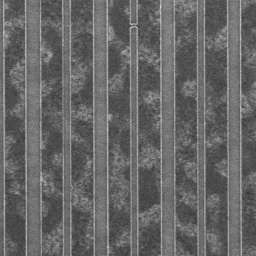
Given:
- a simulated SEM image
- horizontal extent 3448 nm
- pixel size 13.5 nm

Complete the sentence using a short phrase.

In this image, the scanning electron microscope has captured parallel lines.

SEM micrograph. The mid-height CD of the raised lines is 315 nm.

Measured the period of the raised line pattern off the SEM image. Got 0.451 microns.